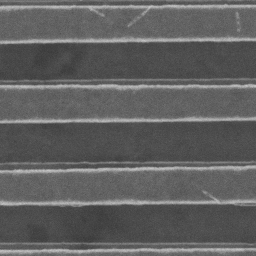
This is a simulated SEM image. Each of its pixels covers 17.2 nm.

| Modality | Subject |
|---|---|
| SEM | lines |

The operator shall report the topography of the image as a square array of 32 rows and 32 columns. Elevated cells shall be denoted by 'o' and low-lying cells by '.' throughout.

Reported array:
oooooooooooooooooooooooooooooooo
oooooooooooooooooooooooooooooooo
oooooooooooooooooooooooooooooooo
oooooooooooooooooooooooooooooooo
oooooooooooooooooooooooooooooooo
................................
................................
................................
................................
................................
oooooooooooooooooooooooooooooooo
oooooooooooooooooooooooooooooooo
oooooooooooooooooooooooooooooooo
oooooooooooooooooooooooooooooooo
oooooooooooooooooooooooooooooooo
................................
................................
................................
................................
................................
oooooooooooooooooooooooooooooooo
oooooooooooooooooooooooooooooooo
oooooooooooooooooooooooooooooooo
oooooooooooooooooooooooooooooooo
oooooooooooooooooooooooooooooooo
ooo.oooooooo....oo...........ooo
................................
................................
................................
................................
.oo....oooo..........ooo........
oooooooooooooooooooooooooooooooo